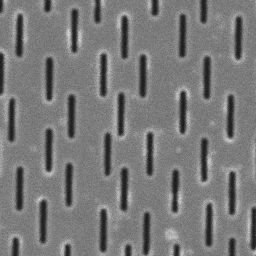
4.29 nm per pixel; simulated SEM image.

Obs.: a regular array of holes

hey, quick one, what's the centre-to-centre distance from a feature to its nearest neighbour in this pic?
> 0.18 micrometres